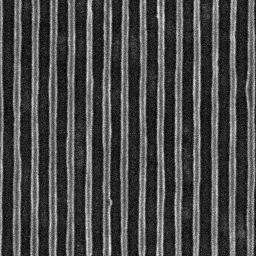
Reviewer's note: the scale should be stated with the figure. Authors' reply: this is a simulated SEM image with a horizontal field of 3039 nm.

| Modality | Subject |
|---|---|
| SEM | parallel lines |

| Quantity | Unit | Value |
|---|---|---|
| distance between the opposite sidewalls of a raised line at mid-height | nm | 71.2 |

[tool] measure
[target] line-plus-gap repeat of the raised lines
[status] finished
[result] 0.213 microns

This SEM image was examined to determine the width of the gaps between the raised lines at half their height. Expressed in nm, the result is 142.